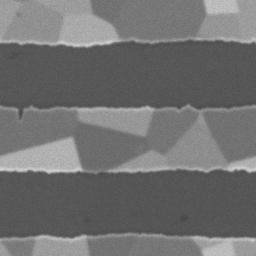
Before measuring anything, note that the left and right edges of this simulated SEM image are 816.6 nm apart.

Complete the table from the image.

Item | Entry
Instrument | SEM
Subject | one or a few lines or trenches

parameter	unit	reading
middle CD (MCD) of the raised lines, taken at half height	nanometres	200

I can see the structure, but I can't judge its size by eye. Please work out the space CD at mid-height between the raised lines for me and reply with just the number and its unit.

212 nanometers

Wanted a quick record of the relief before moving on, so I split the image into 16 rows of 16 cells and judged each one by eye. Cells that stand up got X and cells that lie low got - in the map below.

XXXXXXXXXXXXXXXX
XXXXXXXXXXXXXXXX
XXXXXXXXXXXX-XXX
----------------
----------------
----------------
----------------
XXXXXXXXXXXXXXXX
XXXXXXXXXXXXXXXX
XXXXXXXXXXXXXXXX
XXXXXXXXXXXXXXXX
----------------
----------------
----------------
----------------
XXXXXXXXXXXXXXXX